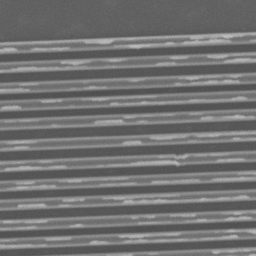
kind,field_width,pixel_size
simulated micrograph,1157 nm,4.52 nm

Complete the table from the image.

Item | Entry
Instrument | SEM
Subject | parallel lines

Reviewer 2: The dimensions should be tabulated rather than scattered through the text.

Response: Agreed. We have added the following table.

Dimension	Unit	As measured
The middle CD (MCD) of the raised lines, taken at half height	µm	0.0412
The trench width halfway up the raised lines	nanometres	49.1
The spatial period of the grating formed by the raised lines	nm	88.4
